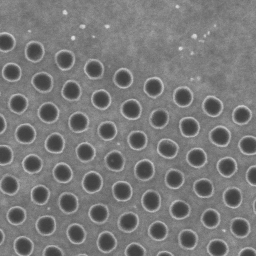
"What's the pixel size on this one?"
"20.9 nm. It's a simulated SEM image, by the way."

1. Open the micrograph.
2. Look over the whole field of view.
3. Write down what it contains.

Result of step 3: a regular array of raised bodies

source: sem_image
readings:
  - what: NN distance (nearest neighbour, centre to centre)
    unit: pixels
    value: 30.5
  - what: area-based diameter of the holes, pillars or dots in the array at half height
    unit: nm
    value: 423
